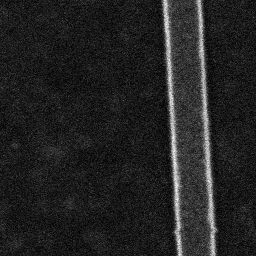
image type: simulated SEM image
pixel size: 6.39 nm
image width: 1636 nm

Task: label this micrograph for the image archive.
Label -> one or a few lines or trenches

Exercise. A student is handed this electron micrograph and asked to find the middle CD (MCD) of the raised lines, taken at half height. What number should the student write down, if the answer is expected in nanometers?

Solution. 217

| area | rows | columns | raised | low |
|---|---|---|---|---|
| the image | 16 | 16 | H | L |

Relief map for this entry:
LLLLLLLLLLHHLLLL
LLLLLLLLLLHHHLLL
LLLLLLLLLLHHHLLL
LLLLLLLLLLLHHLLL
LLLLLLLLLLLHHLLL
LLLLLLLLLLLHHLLL
LLLLLLLLLLLHHLLL
LLLLLLLLLLLHHLLL
LLLLLLLLLLLHHLLL
LLLLLLLLLLLHHLLL
LLLLLLLLLLLHHLLL
LLLLLLLLLLLHHLLL
LLLLLLLLLLLHHLLL
LLLLLLLLLLLHHLLL
LLLLLLLLLLLHHLLL
LLLLLLLLLLLHHLLL